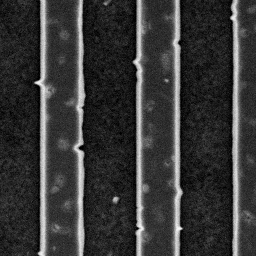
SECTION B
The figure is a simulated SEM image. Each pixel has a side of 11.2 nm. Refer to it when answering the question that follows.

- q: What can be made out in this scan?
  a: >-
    one or a few lines or trenches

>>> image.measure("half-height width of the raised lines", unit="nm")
452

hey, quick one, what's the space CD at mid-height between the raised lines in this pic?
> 55.2 px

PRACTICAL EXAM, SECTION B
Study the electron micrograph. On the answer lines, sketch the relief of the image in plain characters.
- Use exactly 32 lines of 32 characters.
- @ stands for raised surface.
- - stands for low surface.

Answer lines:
-----@@@@@-------@@@@@-------@@@
-----@@@@@-------@@@@@-------@@@
-----@@@@@-------@@@@@-------@@@
-----@@@@@-------@@@@@-------@@@
-----@@@@@-------@@@@@-------@@@
-----@@@@@-------@@@@@-------@@@
-----@@@@@-------@@@@@-------@@@
-----@@@@@-------@@@@@-------@@@
-----@@@@@-------@@@@@-------@@@
-----@@@@@-------@@@@@-------@@@
-----@@@@@-------@@@@@-------@@@
-----@@@@@-------@@@@@-------@@@
-----@@@@@-------@@@@@-------@@@
-----@@@@@-------@@@@@-------@@@
-----@@@@@-------@@@@@-------@@@
-----@@@@@-------@@@@@-------@@@
-----@@@@@-------@@@@@-------@@@
-----@@@@@-------@@@@@-------@@@
-----@@@@@-------@@@@@-------@@@
-----@@@@@-------@@@@@-------@@@
-----@@@@@-------@@@@@-------@@@
-----@@@@@-------@@@@@-------@@@
-----@@@@@-------@@@@@-------@@@
-----@@@@@-------@@@@@-------@@@
-----@@@@@-------@@@@@-------@@@
-----@@@@@-------@@@@@-------@@@
-----@@@@@-------@@@@@-------@@@
-----@@@@@-------@@@@@-------@@@
-----@@@@@-------@@@@@-------@@@
-----@@@@@-------@@@@@-------@@@
-----@@@@@-------@@@@@-------@@@
-----@@@@@-------@@@@@-------@@@